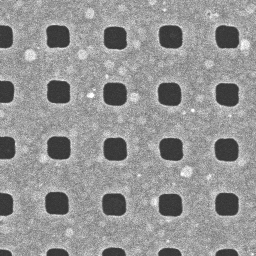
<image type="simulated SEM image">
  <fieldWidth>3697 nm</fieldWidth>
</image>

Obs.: a regular array of holes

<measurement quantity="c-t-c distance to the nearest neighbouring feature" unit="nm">800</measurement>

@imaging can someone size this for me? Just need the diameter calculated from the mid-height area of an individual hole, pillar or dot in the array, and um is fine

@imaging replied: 0.367